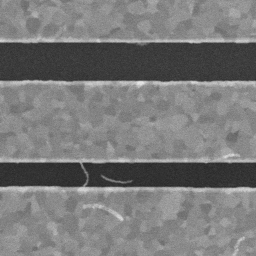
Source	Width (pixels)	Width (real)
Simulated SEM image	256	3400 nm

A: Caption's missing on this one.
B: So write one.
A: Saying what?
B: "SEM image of lines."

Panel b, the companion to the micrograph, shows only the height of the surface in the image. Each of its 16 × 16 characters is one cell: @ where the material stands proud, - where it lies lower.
@@@@@@@@@@@@@@@@
@@@@@@@@@@@@@@@@
@@@@@@@@@@@@@@@@
----------------
----------------
@@@@@@@@@@@@@@@@
@@@@@@@@@@@@@@@@
@@@@@@@@@@@@@@@@
@@@@@@@@@@@@@@@@
@@@@@@@@@@@@@@@@
----------------
----------------
@@@@@@@@@@@@@@@@
@@@@@@@@@@@@@@@@
@@@@@@@@@@@@@@@@
@@@@@@@@@@@@@@@@